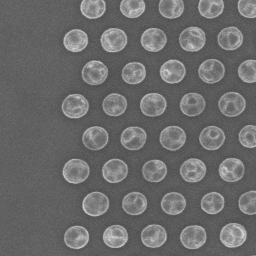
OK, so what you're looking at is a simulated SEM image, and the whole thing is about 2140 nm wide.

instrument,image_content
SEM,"a regular array of raised bodies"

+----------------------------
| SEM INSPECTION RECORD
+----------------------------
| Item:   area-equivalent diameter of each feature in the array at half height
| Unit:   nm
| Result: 202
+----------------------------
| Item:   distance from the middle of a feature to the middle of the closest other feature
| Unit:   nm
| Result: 314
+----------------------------